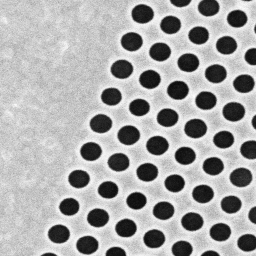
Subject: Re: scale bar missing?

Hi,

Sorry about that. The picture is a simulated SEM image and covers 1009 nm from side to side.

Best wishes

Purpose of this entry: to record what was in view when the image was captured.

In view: a regular array of holes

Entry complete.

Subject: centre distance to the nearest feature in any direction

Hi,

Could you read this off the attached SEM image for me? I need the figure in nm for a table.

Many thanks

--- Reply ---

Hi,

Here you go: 115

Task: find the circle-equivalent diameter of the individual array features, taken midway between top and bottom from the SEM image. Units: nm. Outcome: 80.9